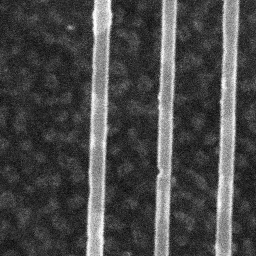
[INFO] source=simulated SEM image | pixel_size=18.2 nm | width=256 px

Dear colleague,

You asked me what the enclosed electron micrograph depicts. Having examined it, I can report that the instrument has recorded one or a few lines or trenches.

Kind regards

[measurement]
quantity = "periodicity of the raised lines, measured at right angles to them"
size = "1170 nanometers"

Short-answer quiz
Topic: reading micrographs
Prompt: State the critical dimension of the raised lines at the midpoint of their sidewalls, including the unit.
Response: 0.234 um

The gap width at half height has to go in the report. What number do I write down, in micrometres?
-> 0.947